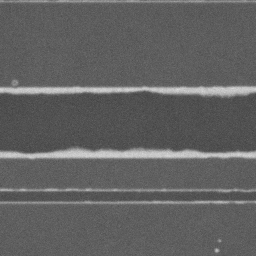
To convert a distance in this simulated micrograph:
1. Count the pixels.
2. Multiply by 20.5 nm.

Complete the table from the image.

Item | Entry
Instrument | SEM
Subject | lines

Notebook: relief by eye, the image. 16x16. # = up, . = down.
################
################
################
################
################
################
................
................
................
................
################
################
################
################
################
################